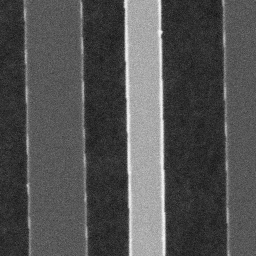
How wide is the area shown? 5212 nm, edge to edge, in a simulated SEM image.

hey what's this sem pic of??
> lines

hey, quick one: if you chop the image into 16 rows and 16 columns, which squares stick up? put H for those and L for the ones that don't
LLHHHLLLHHLLLLHH
LLHHHLLLHHLLLLHH
LLHHHLLLHHLLLLHH
LLHHHLLLHHLLLLHH
LLHHHLLLHHLLLLHH
LLHHHLLLHHLLLLHH
LLHHHLLLHHLLLLHH
LLHHHLLLHHLLLLHH
LLHHHLLLHHLLLLHH
LLHHHLLLHHLLLLHH
LLHHHLLLHHLLLLHH
LLHHHLLLHHLLLLHH
LLHHHLLLHHLLLLHH
LLHHHLLLHHLLLLHH
LLHHHLLLHHLLLLHH
LLHHHLLLHHLLLLHH